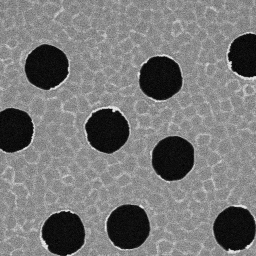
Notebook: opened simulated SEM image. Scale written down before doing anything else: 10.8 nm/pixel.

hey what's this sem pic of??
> holes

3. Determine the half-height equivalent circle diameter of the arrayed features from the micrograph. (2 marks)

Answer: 0.473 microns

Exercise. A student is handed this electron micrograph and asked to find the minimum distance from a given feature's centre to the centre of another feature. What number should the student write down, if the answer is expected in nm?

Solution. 806